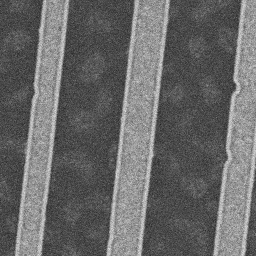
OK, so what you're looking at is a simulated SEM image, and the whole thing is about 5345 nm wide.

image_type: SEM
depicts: one or a few lines or trenches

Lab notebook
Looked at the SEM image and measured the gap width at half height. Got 1.52 micrometres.